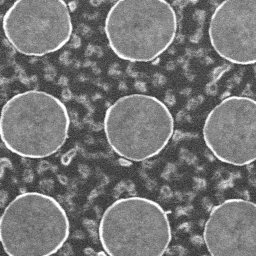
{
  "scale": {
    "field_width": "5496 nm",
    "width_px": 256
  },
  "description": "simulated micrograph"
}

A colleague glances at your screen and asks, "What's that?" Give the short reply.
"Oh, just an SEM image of raised bodies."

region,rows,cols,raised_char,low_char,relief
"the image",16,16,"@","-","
-@@@---@@@@---@@
@@@@---@@@@--@@@
-@@@---@@@@--@@@
--------@@----@@
----------------
----------------
@@@@---@@@----@@
@@@@---@@@@--@@@
@@@@---@@@@--@@@
-@@----@@@---@@@
----------------
----------------
-@@-----@-------
@@@@--@@@@---@@@
@@@@--@@@@@--@@@
@@@@---@@@---@@@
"